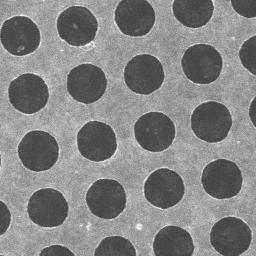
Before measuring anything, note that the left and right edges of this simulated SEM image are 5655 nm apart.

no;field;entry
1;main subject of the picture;a regular array of holes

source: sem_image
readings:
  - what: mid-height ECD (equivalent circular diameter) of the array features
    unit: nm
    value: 917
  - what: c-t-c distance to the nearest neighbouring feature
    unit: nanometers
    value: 1280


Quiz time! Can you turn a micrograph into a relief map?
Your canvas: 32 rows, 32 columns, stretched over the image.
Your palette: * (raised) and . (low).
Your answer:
***************....***.....**...
********...***.....***.....**...
*...***.....**.....***....******
.....**.....***....*****.*******
.....**.....****..**************
.....****...*************.****..
*...*******************....***..
****************....***.....**..
*********...****....***.....***.
**...***.....**......**....*****
*.....**.....***....*****.******
*.....***....****..*************
*.....***...********************
**...*******************....***.
******************...***.....**.
***********..****.....**.....***
****..****....***.....**.....***
***....***.....**.....***...****
**.....***.....***...***********
**.....***....******************
***....*******************...***
*******************...***.....**
************..****.....**.....**
***********....***.....**.....**
****....***.....**.....***...***
.**......**.....***...**********
.**......**....*****************
.***....*******************...**
.*******************...***.....*
**************.****.....**......
************.....**.....**.....*
*****....***.....**.....***....*